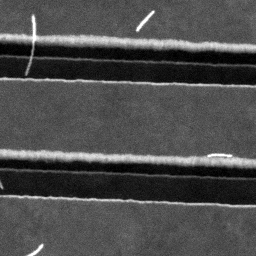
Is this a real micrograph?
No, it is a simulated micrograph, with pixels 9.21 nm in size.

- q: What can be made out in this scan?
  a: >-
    lines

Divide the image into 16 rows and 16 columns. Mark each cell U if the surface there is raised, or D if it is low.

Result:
UUUUUUUUUUUUUUUU
UUUUUUUUUUUUUUUU
DUUUUUUUUUUUUUUU
DDDDDDDDDDDDDDDD
DDDDDDDDDDDDDDDD
UUUUUUUUUUUUUUUU
UUUUUUUUUUUUUUUU
UUUUUUUUUUUUUUUU
UUUUUUUUUUUUUUUU
UUUUUUUUUUUUUUUU
DDDDDDDDDDDDDDDD
DDDDDDDDDDDDDDDD
UUUUUUUUDDDDDDDD
UUUUUUUUUUUUUUUU
UUUUUUUUUUUUUUUU
UUUUUUUUUUUUUUUU